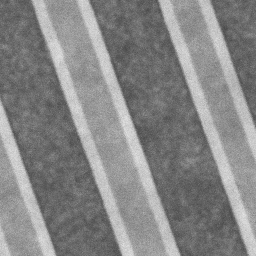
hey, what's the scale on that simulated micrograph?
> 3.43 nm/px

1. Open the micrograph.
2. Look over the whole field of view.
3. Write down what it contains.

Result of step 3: one or a few lines or trenches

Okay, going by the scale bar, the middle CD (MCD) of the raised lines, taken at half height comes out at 145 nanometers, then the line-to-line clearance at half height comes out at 261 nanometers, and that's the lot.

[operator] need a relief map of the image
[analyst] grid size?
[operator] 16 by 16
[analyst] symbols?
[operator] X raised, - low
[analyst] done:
---XX-----XXX---
---XXX-----XX---
---XXX-----XXX--
----XX------XX--
----XXX-----XX--
----XXX-----XXX-
-----XX------XX-
-----XXX-----XX-
-----XXX-----XXX
X-----XXX-----XX
X-----XXX-----XX
X-----XXX-----XX
XX-----XXX-----X
XX-----XXX-----X
XXX----XXX-----X
XXX-----XXX-----